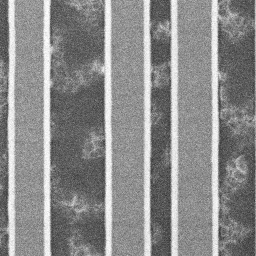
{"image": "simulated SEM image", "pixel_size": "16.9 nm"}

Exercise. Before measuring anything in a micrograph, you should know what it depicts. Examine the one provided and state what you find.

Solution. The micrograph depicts one or a few lines or trenches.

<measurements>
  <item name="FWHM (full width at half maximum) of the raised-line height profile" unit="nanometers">661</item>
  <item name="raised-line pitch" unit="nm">1400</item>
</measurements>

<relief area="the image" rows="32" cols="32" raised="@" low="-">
--@@@@--------@@@@----@@@@@-----
--@@@@--------@@@@----@@@@@-----
--@@@@--------@@@@----@@@@@-----
--@@@@--------@@@@----@@@@@-----
--@@@@--------@@@@----@@@@@-----
--@@@@--------@@@@----@@@@@-----
--@@@@--------@@@@----@@@@@-----
--@@@@--------@@@@----@@@@@-----
--@@@@--------@@@@----@@@@@-----
-@@@@@--------@@@@----@@@@@-----
-@@@@@--------@@@@----@@@@@-----
-@@@@@--------@@@@----@@@@@-----
-@@@@@--------@@@@----@@@@@-----
-@@@@@--------@@@@----@@@@@-----
-@@@@@--------@@@@----@@@@@-----
-@@@@@--------@@@@----@@@@@-----
-@@@@@--------@@@@----@@@@@-----
-@@@@@--------@@@@----@@@@@-----
-@@@@@--------@@@@----@@@@@-----
-@@@@@--------@@@@----@@@@@-----
-@@@@@--------@@@@----@@@@@-----
-@@@@@--------@@@@----@@@@@-----
-@@@@@--------@@@@----@@@@@-----
-@@@@@--------@@@@----@@@@@-----
-@@@@@--------@@@@----@@@@@-----
-@@@@@--------@@@@----@@@@@-----
-@@@@@--------@@@@----@@@@@-----
-@@@@@--------@@@@----@@@@@-----
-@@@@@--------@@@@----@@@@@-----
-@@@@@--------@@@@----@@@@@-----
-@@@@@--------@@@@----@@@@@-----
-@@@@@--------@@@@----@@@@@-----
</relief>